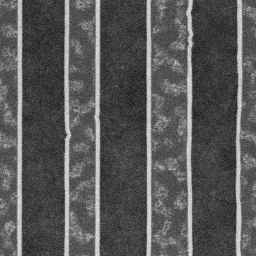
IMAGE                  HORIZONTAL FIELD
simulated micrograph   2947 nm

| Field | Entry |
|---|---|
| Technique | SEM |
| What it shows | one or a few lines or trenches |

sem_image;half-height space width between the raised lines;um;0.564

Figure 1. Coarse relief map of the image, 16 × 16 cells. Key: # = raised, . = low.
#...##...###...#
#...##...###...#
#...##...###...#
#...##...###...#
#...##...###...#
#...##...###...#
#...##...###...#
#...##...###...#
#...##...###...#
#...##...###...#
#...##...###...#
#...##...###...#
#...##...###...#
#...##...###...#
#...##...###...#
#...##...###...#